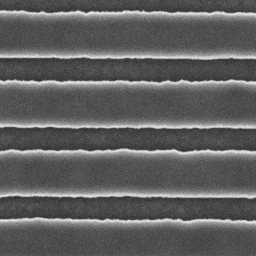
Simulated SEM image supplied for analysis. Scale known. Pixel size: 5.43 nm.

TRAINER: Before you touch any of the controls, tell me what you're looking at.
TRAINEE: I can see lines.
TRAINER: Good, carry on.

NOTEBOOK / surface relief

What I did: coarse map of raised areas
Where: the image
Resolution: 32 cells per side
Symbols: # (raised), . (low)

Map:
................................
####....##.#..####.##...........
################################
################################
################################
################################
################################
................................
................................
................................
################################
################################
################################
################################
################################
################################
................................
................................
................................
################################
################################
################################
################################
################################
#..#..#########.################
................................
................................
############.##...#####.#####...
################################
################################
################################
################################